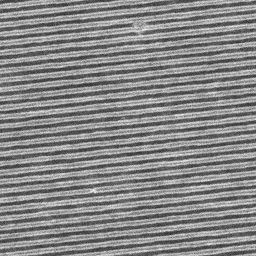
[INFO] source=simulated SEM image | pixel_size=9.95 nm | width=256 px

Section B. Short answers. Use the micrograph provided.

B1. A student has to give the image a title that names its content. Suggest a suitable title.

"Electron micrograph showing parallel lines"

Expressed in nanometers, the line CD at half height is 38.3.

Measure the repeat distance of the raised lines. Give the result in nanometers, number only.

91.1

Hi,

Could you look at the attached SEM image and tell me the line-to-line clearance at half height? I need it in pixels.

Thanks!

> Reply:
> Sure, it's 4.84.